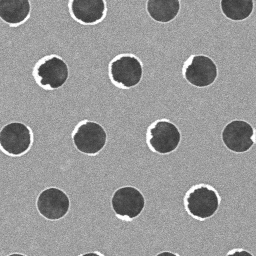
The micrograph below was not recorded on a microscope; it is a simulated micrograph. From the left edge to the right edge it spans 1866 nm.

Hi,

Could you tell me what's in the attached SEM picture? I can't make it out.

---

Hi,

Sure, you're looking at a regular array of holes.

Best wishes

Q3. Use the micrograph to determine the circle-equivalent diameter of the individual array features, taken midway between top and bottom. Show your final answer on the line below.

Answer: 30.9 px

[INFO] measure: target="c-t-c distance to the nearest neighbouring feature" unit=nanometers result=541